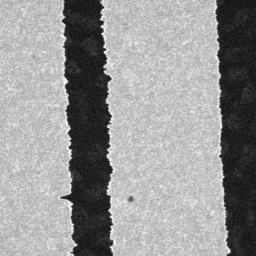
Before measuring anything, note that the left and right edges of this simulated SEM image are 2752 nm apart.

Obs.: one or a few lines or trenches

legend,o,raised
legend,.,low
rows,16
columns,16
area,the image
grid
oooo..ooooooo...
oooo..oooooooo..
oooo...ooooooo..
oooo...ooooooo..
oooo...ooooooo..
oooo...ooooooo..
oooo...ooooooo..
oooo...ooooooo..
oooo...ooooooo..
oooo...ooooooo..
oooo...ooooooo..
oooo...ooooooo..
oooo...ooooooo..
oooo...ooooooo..
ooooo..ooooooo..
ooooo..ooooooo..